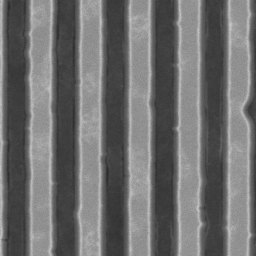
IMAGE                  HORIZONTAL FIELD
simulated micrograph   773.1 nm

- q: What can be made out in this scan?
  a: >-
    parallel lines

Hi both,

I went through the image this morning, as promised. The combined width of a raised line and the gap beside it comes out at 149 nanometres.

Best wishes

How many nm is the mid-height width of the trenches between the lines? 73.9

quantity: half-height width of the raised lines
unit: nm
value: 76.1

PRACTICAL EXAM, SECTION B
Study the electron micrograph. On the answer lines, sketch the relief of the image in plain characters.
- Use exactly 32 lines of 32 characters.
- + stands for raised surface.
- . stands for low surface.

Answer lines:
+...+++...+++...+++...+++...+++.
+...+++...+++...+++...+++...+++.
+...+++...+++...+++...+++...+++.
....+++...+++...+++...+++...+++.
....+++...+++...+++...+++...+++.
+...+++...+++...+++...+++...+++.
+..++++...+++...+++...+++...+++.
+...+++...+++...+++...+++...+++.
+...+++...+++...+++...+++...+++.
+..++++...+++...+++...+++...+++.
+..++++...+++...+++...+++...+++.
....+++...+++...+++...+++...+++.
....+++...+++...+++...+++...+++.
....+++...+++...+++...+++...+++.
....+++...+++...+++...+++...+++.
....+++...+++...+++...+++...+++.
...++++...+++...+++...+++...+++.
+...+++...+++...+++...+++...+++.
...++++...+++...+++...+++...+++.
...++++...+++...+++...+++...+++.
....+++...+++...+++...+++...+++.
....+++...+++...+++...+++...+++.
....+++...+++...+++...+++...+++.
....+++...+++...+++...+++...+++.
....+++...+++...+++...+++...+++.
....+++...+++...+++...+++...+++.
....+++...+++...+++...+++...+++.
....+++...+++...+++...+++...+++.
....+++...+++...+++...+++...+++.
....+++...+++...+++...+++...+++.
....+++...+++...+++...+++...+++.
....+++...+++...+++...+++...+++.